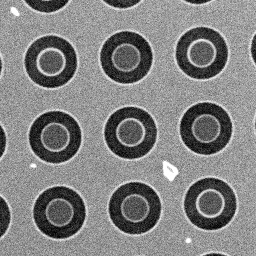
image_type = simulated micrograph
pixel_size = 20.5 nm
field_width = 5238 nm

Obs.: an array of small figures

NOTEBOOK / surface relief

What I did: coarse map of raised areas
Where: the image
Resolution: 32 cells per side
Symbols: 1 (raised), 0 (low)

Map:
11100000111110000111111101111111
11111001111111111111111111111111
11111111111111111111111111111111
11111111111111111111111100111111
11111001111111000011111000001111
11110000011110000001110000001110
11100000011110000001110000000110
11100000001100000001110000001111
11100000001110000001110000001111
11110000011110000011111000011111
11111000111111111111111111111111
11111111111111111111111111111111
11111111111111111111111111111111
11111111111111100011111100001111
11111000011111000001111000000111
11110000001110000001110000000111
01110000001110000000110000000111
01110000001110000000111000000111
01110000001111000001111000001111
11111000011111100011111111111111
11111111111111111111111111111111
11111111111111111111111111111111
11111111111111111111111110001111
11111100011111100001111100000111
11111000001111000000111000000011
01110000000111000000111000000011
01110000000111000000111000000111
01110000000111000000111100000111
01111000001111100001111110001111
11111100011111111111111111111111
11111111111111111111111111111111
11111111111111111111111111111111